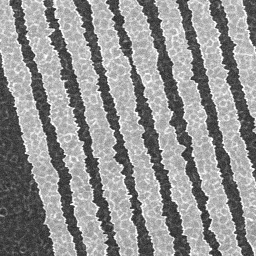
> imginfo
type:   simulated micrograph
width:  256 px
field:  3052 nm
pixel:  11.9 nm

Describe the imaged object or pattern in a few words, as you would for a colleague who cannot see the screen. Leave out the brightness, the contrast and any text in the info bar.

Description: parallel lines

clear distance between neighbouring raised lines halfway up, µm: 0.151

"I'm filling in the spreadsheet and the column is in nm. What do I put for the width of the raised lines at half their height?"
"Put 231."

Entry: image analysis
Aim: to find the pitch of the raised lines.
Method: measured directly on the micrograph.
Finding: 382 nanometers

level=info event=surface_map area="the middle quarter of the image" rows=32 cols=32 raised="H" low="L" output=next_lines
LLHHHHHLLLHHHHHHHLHHHHHLLLLHHHHH
LLLHHHHLLLLHHHHHHLHHHHHLLLLHHHHH
LLLHHHHHLLLHHHHHHLLHHHHHLLLHHHHH
LLLHHHHHLLLHHHHHLLLHHHHHLLLLHHHH
LLLLHHHHLLLHHHHHHLLLHHHHHLLLHHHH
LLLLHHHHLLLHHHHHHLLLHHHHHLLLHHHH
LLLLHHHHLLLLHHHHHLLLHHHHHLLLLHHH
HLLLHHHHHLLLHHHHHLLLHHHHHLLLLHHH
HLLLLHHHHLLLHHHHHHLLLHHHHHLLLLHH
HLLLLHHHHHLLLHHHHHLLLHHHHHLLLLHH
HLLLLHHHHHLLLHHHHHLLLLHHHHLLLLHH
HHLLLHHHHHLLLHHHHHLLLLHHHHLLLLHH
HHLLLHHHHHHLLHHHHHLLLLHHHHHLLLHH
HHHLLLHHHHLLLLHHHHHLLLHHHHHLLLHH
HHLLLLHHHHHLLLHHHHLLLLLHHHLLLLLH
HHHLLLHHHHHLLLHHHHHLLLLHHHHLLLLH
HHHLLLHHHHHHLLHHHHHHLLLHHHHHLLLH
HHHLLLLHHHHHLLLHHHHHLLLLHHHHLLLH
HHHHLLLHHHHHHLLHHHHLLLLLHHHHLLLL
HHHHLLLHHHHHHLLHHHHHLLLLHHHHLLLL
HHHHHLLHHHHHLLLHHHHHLLLLHHHHHHLL
HHHHHLLHHHHHLLLLHHHHHLLLLHHHHHLL
HHHHHLLHHHHHHLLLHHHHHLLLLHHHHLLL
HHHHHLLLLHHHLLLLHHHHHLLLLHHHHHLL
HHHHHLLLLHHHHLLLLHHHHHLLLHHHHHLL
LHHHHLLLLHHHHHLLLHHHHHLLLHHHHHLL
LHHHHLLLLHHHHHLLLHHHHHLLLLHHHHLL
LLHHHHLLLHHHHHLLLHHHHHLLLLHHHHLL
LLHHHHLLLHHHHHHLLLHHHHHLLLHHHHHL
LLHHHHLLLLHHHHHLLLHHHHHHLLLHHHHH
LLHHHHHLLLHHHHHLLLHHHHHHLLLHHHHH
LLHHHHHLLLHHHHHHLLHHHHHHLLLHHHHH